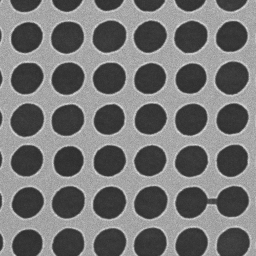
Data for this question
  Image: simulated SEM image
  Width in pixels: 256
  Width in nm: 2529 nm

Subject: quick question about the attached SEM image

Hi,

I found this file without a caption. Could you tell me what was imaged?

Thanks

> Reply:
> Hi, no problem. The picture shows a regular array of holes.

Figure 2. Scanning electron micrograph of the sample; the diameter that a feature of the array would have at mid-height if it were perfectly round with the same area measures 321 nanometers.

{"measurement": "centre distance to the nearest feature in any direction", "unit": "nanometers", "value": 403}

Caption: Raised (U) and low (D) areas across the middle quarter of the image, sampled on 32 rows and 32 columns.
DDDDUUUUUDDDDDUUUUUDDDDDUUUUUUDD
DDDDDUUUDDDDDDDUUUDDDDDDDUUUUDDD
DDDDDUUDDDDDDDDUUUDDDDDDDDUUDDDD
DDDDDUUDDDDDDDDDUUDDDDDDDDUUDDDD
DDDDDUUDDDDDDDDUUUDDDDDDDUUUDDDD
DDDDUUUDDDDDDDDUUUDDDDDDDUUUDDDD
DDDDUUUUDDDDDDUUUUDDDDDDUUUUUDDD
DDUUUUUUUUUDUUUUUUUUUDUUUUUUUUUD
UUUUUUUUUUUUUUUUUUUUUUUUUUUUUUUU
UUUUUUUUUUUUUUUUUUUUUUUUUUUUUUUU
DDDDUUUUUUDDDDUUUUUUDDDDUUUUUUDD
DDDDUUUUDDDDDDDUUUDDDDDDDUUUUDDD
DDDDDUUUDDDDDDDUUUDDDDDDDDUUDDDD
DDDDDUUDDDDDDDDUUUDDDDDDDDUUDDDD
DDDDDUUDDDDDDDDUUUDDDDDDDDUUDDDD
DDDDDUUDDDDDDDDUUUDDDDDDDUUUDDDD
DDDDUUUUDDDDDDUUUUDDDDDDUUUUDDDD
DDDUUUUUUDDDDUUUUUUUDDDUUUUUUUDD
UUUUUUUUUUUUUUUUUUUUUUUUUUUUUUUU
UUUUUUUUUUUUUUUUUUUUUUUUUUUUUUUU
UUUUUUUUUUDDDUUUUUUUDDDUUUUUUUUD
DDDDUUUUUDDDDDDUUUUDDDDDDUUUUDDD
DDDDDUUUDDDDDDDUUUDDDDDDDUUUUDDD
DDDDDUUDDDDDDDDDUUDDDDDDDDUUDDDD
DDDDDUUDDDDDDDDDUDDDDDDDDDUUDDDD
DDDDDUUDDDDDDDDUUUDDDDDDDUUUDDDD
DDDDUUUUDDDDDDDUUUDDDDDDDUUUDDDD
DDDUUUUUUDDDDUUUUUUDDDDDUUUUUDDD
UUUUUUUUUUUUUUUUUUUUUUUUUUUUUUUU
UUUUUUUUUUUUUUUUUUUUUUUUUUUUUUUU
UDUUUUUUUUUUUUUUUUUUUUDUUUUUUUUU
DDDDUUUUUDDDDDUUUUUDDDDDDUUUUDDD